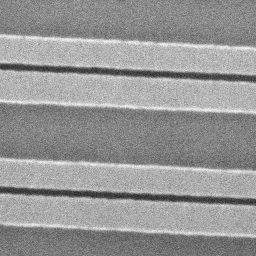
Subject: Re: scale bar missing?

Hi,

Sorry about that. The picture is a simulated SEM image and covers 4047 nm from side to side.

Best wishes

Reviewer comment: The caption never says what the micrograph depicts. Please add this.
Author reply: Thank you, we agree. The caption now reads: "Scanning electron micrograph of lines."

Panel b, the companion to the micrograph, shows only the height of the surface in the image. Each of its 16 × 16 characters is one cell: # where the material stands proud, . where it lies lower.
................
................
####............
################
################
################
....############
................
................
................
##########......
################
################
################
..........######
................